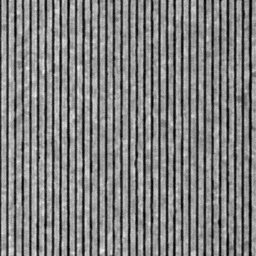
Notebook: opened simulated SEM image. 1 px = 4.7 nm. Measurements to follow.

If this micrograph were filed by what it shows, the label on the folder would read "parallel lines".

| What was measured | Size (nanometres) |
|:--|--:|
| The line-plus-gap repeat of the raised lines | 35.6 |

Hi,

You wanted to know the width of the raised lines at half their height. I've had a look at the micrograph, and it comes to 22.3 nanometres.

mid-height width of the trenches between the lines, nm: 13.5